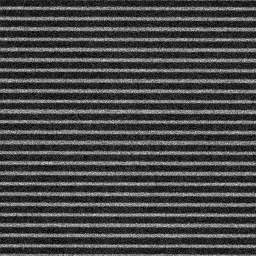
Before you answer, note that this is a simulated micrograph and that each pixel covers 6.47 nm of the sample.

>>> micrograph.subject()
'parallel lines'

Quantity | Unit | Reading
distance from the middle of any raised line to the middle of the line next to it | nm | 66.8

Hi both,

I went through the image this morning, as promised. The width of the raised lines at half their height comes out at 2.87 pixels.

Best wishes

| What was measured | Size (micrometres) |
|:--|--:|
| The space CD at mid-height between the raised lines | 0.0445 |